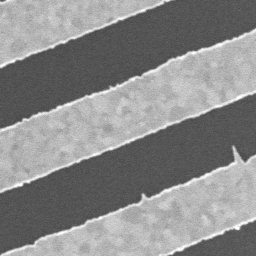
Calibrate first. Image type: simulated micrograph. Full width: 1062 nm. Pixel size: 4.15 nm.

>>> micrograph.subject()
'one or a few lines or trenches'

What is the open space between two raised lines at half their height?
249 nm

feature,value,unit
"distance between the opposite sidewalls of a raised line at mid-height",237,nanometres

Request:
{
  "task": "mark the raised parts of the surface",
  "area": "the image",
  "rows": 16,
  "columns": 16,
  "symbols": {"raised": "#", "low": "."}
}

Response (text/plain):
#########.......
#######.........
####..........##
##.........#####
.........#######
.......#########
....##########..
..#########.....
#########.......
######..........
####..........##
#...........####
.........#######
.......#########
....##########..
.##########.....